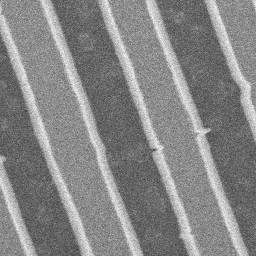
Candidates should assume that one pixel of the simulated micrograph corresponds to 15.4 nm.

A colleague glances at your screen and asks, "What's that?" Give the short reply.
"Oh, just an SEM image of one or a few lines or trenches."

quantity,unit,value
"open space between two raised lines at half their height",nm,794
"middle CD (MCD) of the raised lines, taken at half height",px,48.6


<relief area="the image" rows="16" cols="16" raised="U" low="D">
UUUDDDDUUUDDDUUU
UUUDDDDUUUDDDDUU
UUUUDDDUUUDDDDUU
DUUUDDDDUUUDDDUU
DUUUUDDDUUUDDDDU
DDUUUDDDUUUUDDDU
DDUUUDDDDUUUDDDU
DDUUUUDDDUUUDDDD
DDDUUUDDDUUUUDDD
DDDUUUDDDDUUUDDD
DDDUUUUDDDUUUDDD
DDDDUUUDDDDUUUDD
UDDDUUUDDDDUUUDD
UDDDDUUUDDDUUUDD
UDDDDUUUDDDDUUUD
UUDDDUUUUDDDUUUD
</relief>